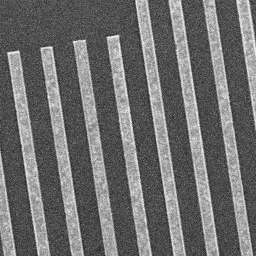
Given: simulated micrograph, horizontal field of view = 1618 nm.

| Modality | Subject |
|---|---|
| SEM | parallel lines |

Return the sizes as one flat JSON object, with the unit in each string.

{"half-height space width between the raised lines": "22.1 px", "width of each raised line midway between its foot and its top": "69.5 nanometres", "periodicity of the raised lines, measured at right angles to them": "211 nanometres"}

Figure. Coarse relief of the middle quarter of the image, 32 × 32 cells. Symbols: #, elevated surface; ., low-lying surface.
...###......###.....###......##.
...###......###......##......###
....##......###......##......###
....###.....###......###.....###
....###.....###......###.....###
....###......##......###......##
....###......###.....###......##
.....##......###......##......##
.....##......###......##......##
.....###.....###......##......##
.....###.....###......###.....##
.....###......##......###.....##
.....###......###.....###......#
.....###......##......###......#
.....###......###......##......#
......##......###......##......#
......###.....###......###.....#
......###.....###......###.....#
......###......##......###......
......###......##......###......
#.....###......###.....###......
#......##......###......##......
#......##......###......##......
#......###.....###......###.....
#......###......##......###.....
#......###......##......###.....
##.....###......###.....###.....
##.....###......###......##.....
##......##......###......##.....
##......###.....###......##.....
##......###.....###......###....
##......###......##......###....